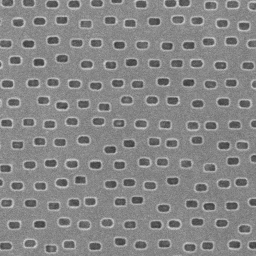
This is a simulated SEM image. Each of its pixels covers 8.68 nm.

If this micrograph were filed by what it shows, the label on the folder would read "a regular array of holes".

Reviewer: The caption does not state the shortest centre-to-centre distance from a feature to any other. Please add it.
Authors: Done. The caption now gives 172 nm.